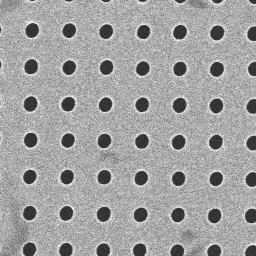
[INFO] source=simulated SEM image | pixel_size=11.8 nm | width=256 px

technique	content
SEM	a regular array of holes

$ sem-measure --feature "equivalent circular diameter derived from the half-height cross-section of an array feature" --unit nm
167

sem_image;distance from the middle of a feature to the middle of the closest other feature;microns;0.429